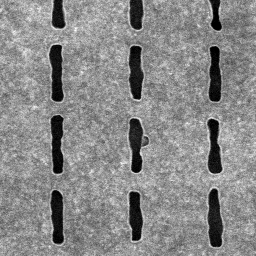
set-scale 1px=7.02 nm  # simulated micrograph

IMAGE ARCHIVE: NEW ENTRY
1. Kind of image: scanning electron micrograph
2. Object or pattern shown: a regular array of holes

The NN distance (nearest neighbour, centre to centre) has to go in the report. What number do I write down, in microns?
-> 0.507